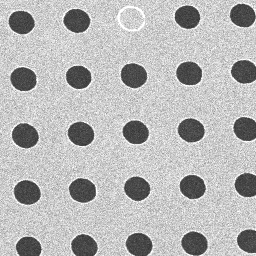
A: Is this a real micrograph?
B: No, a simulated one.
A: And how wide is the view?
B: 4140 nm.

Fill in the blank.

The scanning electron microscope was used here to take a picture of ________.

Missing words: a regular array of holes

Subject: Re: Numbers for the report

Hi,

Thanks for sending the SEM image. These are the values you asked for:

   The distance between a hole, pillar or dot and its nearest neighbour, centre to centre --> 55.3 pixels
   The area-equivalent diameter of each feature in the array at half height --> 0.414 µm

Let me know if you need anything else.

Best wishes